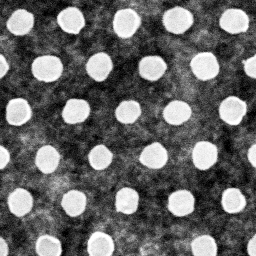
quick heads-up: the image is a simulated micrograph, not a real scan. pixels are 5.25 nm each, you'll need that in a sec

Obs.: a regular array of raised bodies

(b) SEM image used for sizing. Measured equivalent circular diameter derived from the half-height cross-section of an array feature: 135 nm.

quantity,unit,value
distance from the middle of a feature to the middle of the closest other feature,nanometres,268